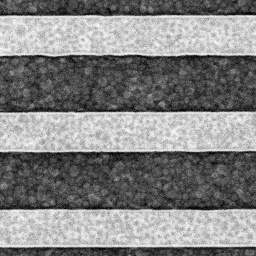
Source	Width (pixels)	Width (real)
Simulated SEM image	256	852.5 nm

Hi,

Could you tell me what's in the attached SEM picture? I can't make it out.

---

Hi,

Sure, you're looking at one or a few lines or trenches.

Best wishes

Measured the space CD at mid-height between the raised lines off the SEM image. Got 194 nm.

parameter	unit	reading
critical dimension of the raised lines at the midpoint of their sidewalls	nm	126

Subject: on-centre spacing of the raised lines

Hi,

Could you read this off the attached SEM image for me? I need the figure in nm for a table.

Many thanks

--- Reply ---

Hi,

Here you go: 320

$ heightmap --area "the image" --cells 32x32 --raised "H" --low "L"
LLLLLLLLLLLLLLLLLLLLLLLLLLLLLLLL
LLLLLLLLLLLLLLLLLLLLLLLLLLLLLLLL
HHHHHHHHHHHHHHHHHHHHHHHHHHHHHHHH
HHHHHHHHHHHHHHHHHHHHHHHHHHHHHHHH
HHHHHHHHHHHHHHHHHHHHHHHHHHHHHHHH
HHHHHHHHHHHHHHHHHHHHHHHHHHHHHHHH
HHHHHHHHHHHHHHHHHHHHHHHHHHHHHHHH
LLLLLLLLLLLLLLLLLLLLLLLLLLLLLLLL
LLLLLLLLLLLLLLLLLLLLLLLLLLLLLLLL
LLLLLLLLLLLLLLLLLLLLLLLLLLLLLLLL
LLLLLLLLLLLLLLLLLLLLLLLLLLLLLLLL
LLLLLLLLLLLLLLLLLLLLLLLLLLLLLLLL
LLLLLLLLLLLLLLLLLLLLLLLLLLLLLLLL
LLLLLLLLLLLLLLLLLLLLLLLLLLLLLLLL
HHHHHHHHHHHHHHHHHHHHHHHHHHHHHHHH
HHHHHHHHHHHHHHHHHHHHHHHHHHHHHHHH
HHHHHHHHHHHHHHHHHHHHHHHHHHHHHHHH
HHHHHHHHHHHHHHHHHHHHHHHHHHHHHHHH
HHHHHHHHHHHHHHHHHHHHHHHHHHHHHHHH
LLLLLLLLLLLLLLLLLLLLLLLLLLLLLLLL
LLLLLLLLLLLLLLLLLLLLLLLLLLLLLLLL
LLLLLLLLLLLLLLLLLLLLLLLLLLLLLLLL
LLLLLLLLLLLLLLLLLLLLLLLLLLLLLLLL
LLLLLLLLLLLLLLLLLLLLLLLLLLLLLLLL
LLLLLLLLLLLLLLLLLLLLLLLLLLLLLLLL
LLLLLLLLLLLLLLLLLLLLLLLLLLLLLLLL
HHHHHHHHHHHHHHHHHHHHHHHHHHHHHHHH
HHHHHHHHHHHHHHHHHHHHHHHHHHHHHHHH
HHHHHHHHHHHHHHHHHHHHHHHHHHHHHHHH
HHHHHHHHHHHHHHHHHHHHHHHHHHHHHHHH
HHHHHHHHHHHHHHHHHHHHHHHHHHHHHHHH
LLLLLLLLLLLLLLLLLLLLLLLLLLLLLLLL